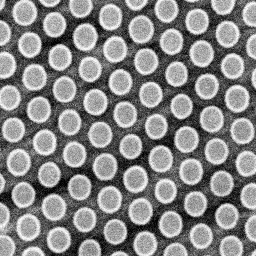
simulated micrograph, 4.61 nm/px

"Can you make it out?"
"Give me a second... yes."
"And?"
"a regular array of raised bodies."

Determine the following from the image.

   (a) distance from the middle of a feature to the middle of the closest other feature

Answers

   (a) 148 nanometers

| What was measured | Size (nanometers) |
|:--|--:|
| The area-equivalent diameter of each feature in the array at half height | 106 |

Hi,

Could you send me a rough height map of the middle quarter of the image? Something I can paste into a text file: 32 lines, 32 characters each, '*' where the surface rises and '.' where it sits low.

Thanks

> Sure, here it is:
*...*****.........*****...****..
....*****..........***....*****.
....*****...****..........*****.
*....***....*****.........*****.
**.........******.........****..
***.........*****...***.........
***.........****...*****........
***...****.........*****........
**...*****.........*****....***.
.....******.........****...*****
.....******..****....*.....*****
......****...*****.........*****
***....*.....*****..........***.
****.........*****...****.......
****.........****....*****......
****...****....*.....*****......
***....*****.........****....***
.*....******.........****...****
......******...***.....*....****
.......****....****.........****
.***....**....*****.........****
*****.........*****...****...***
*****..........****...*****.....
*****...****....*....******.....
.****...*****.........*****...**
..*.....*****.........****...***
........*****...****...**....***
........*****..*****.........***
..***....***...******........***
.*****.........******...***....*
.******.........****...*****....
.*****....***....**....*****....